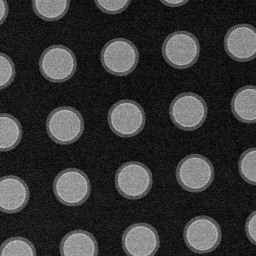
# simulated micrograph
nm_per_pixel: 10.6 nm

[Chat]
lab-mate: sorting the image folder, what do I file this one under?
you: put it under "an array of small figures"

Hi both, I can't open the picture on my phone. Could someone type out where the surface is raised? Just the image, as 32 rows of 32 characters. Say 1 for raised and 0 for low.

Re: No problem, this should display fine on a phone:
10001111100011110000111000000000
10001111000001100000000000000000
10000010000000000000000000000000
00000000000000000000000000000111
00000000000000000000011100001111
00000000000001111000111110001111
00000111100001111000111110001111
10000111110001111000011110000110
11000111110001111000001000000000
11000111100000000000000000000000
10000000000000000000000000000000
00000000000000000000000000000111
00000000000000010000001110000111
00000001100000111100011111000111
11000011110001111100011111000111
11100011110000111100001110000000
11100011110000111000000000000000
11100001110000000000000000000000
11000000000000000000000000000001
00000000000000000000000110000011
00000000000000011100001111000011
00000000110000011110001111100011
11100001111000111110001111100001
11110001111000011110000111000000
11110001111000011100000000000000
11100000110000000000000000000000
11000000000000000000000000000000
00000000000000000000000011100001
00000000000000001110000111110001
00000000111100011111000111110001
11110000111100011111000111100000
11110000111100001111000011000000